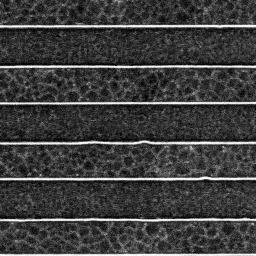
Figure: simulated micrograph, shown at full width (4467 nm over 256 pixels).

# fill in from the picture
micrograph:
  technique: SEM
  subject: one or a few lines or trenches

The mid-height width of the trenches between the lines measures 0.707 micrometres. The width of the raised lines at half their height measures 637 nm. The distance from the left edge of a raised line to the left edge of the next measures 1330 nm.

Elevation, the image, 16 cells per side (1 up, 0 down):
1111111111111111
1111111111111111
0000000000000000
0000000000000000
1111111111111111
1111111111111111
0000000000000000
0000000000000000
0000000000000000
1111111111111111
1111111111111111
0000000000000000
0000000000000000
0000000000000000
1111111111111111
1111111111111111